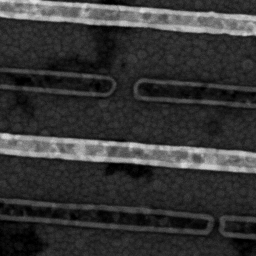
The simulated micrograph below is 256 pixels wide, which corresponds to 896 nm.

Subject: one or a few lines or trenches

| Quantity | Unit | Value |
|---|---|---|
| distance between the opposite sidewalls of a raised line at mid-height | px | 16.5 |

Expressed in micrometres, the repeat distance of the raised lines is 0.234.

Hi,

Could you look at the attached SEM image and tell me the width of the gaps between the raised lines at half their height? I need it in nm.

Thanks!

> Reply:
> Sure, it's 171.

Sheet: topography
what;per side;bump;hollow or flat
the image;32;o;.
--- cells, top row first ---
ooooooo.........................
oooooooooooooooooooooo..........
.........ooooooooooooooooooooooo
......................oooooooooo
................................
................................
................................
................................
................................
ooooooooooo.....................
oooooooooooooo...oooooo.........
........oooooo...ooooooooooooooo
.....................ooooooooooo
................................
................................
................................
................................
ooooooo.........................
ooooooooooooooooooooo...........
........oooooooooooooooooooooooo
....................oooooooooooo
................................
................................
................................
................................
ooooo...........................
oooooooooooooooooooo............
.....ooooooooooooooooooooo..oooo
.................ooooooooo..oooo
..............................oo
................................
................................